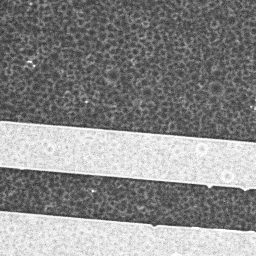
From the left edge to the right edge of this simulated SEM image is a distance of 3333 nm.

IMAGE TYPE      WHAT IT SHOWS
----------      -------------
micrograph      one or a few lines or trenches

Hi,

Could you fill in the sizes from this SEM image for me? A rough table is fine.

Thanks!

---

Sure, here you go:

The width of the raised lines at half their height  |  576 nm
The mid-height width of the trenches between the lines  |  46.1 pixels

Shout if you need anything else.